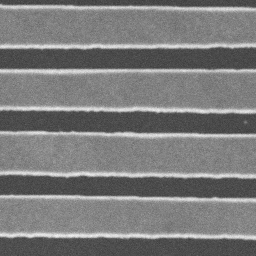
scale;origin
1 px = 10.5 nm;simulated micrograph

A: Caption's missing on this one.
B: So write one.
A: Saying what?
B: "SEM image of lines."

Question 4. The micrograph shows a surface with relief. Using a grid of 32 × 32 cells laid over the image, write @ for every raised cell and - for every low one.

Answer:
--------------------------------
@@@@@@@@@@@@@@@@@@@@@@@@@@@@@@@@
@@@@@@@@@@@@@@@@@@@@@@@@@@@@@@@@
@@@@@@@@@@@@@@@@@@@@@@@@@@@@@@@@
@@@@@@@@@@@@@@@@@@@@@@@@@@@@@@@@
@@@@@@@@@@@@@@@@@@@@@@@@@@@@@@@@
--------------------------------
--------------------------------
--------------------------------
@@@@@@@@@@@@@@@@@@@@@@@@@@@@@@@@
@@@@@@@@@@@@@@@@@@@@@@@@@@@@@@@@
@@@@@@@@@@@@@@@@@@@@@@@@@@@@@@@@
@@@@@@@@@@@@@@@@@@@@@@@@@@@@@@@@
@@@@@@@@@@@@@@@@@@@@@@@@@@@@@@@@
--------------------------------
--------------------------------
@--@@---------------------------
@@@@@@@@@@@@@@@@@@@@@@@@@@@@@@@@
@@@@@@@@@@@@@@@@@@@@@@@@@@@@@@@@
@@@@@@@@@@@@@@@@@@@@@@@@@@@@@@@@
@@@@@@@@@@@@@@@@@@@@@@@@@@@@@@@@
@@@@@@@@@@@@@@@@@@@@@@@@@@@@@@@@
--------------------------------
--------------------------------
@@@@@@@@@-----------------------
@@@@@@@@@@@@@@@@@@@@@@@@@@@@@@@@
@@@@@@@@@@@@@@@@@@@@@@@@@@@@@@@@
@@@@@@@@@@@@@@@@@@@@@@@@@@@@@@@@
@@@@@@@@@@@@@@@@@@@@@@@@@@@@@@@@
@@@@@@@@@@@@@@@@@@@@@@@@@@@@@@@@
--------------------------------
--------------------------------